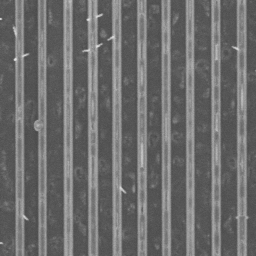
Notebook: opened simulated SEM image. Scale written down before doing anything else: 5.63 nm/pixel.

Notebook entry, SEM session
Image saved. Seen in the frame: parallel lines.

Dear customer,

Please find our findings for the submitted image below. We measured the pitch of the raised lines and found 24.7 px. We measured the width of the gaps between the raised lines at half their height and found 0.0971 microns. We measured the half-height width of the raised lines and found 7.25 px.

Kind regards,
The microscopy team